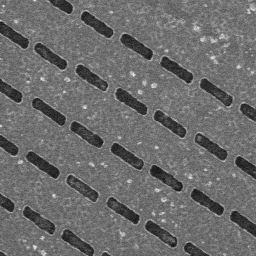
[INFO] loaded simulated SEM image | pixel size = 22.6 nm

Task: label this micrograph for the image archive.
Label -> a regular array of holes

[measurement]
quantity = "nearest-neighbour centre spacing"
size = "1020 nm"